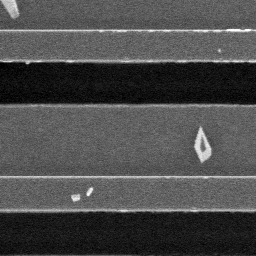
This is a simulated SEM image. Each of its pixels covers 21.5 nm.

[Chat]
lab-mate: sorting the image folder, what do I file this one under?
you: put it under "lines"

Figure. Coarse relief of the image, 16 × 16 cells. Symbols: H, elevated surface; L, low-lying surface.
HHHHHHHHHHHHHHHH
HHHHHHHHHHHHHHHH
HHHHHHHHHHHHHHHH
HHHHHHHHHHHHHHHH
LLLLLLLLLLLLLLLL
LLLLLLLLLLLLLLLL
LLLLLLLLLLLLLLLL
HHHHHHHHHHHHHHHH
HHHHHHHHHHHHHHHH
HHHHHHHHHHHHHHHH
HHHHHHHHHHHHHHHH
HHHHHHHHHHHHHHHH
HHHHHHHHHHHHHHHH
LLLLLLLLLLLLLLLL
LLLLLLLLLLLLLLLL
LLLLLLLLLLLLLLLL